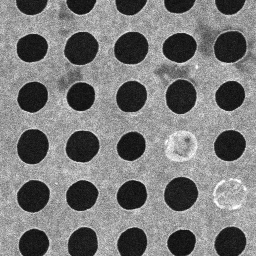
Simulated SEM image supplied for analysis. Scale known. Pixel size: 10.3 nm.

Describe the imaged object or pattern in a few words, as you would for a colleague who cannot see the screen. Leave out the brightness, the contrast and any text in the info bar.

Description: a regular array of holes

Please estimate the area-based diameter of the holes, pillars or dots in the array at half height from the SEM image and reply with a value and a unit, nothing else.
323 nanometers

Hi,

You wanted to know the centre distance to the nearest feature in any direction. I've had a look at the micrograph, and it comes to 502 nanometres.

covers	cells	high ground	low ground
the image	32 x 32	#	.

##....##....##....###...###...##
###..####..####..####..#####..##
################################
################################
###..####...###...###...###...##
##....##....##....##....###....#
##....##....##....##....###....#
###..####...###...###...###...##
################################
################################
###..#####.####...###...####..##
##....###...###...###....##....#
##....##....###...###....##....#
###..####..####...###...####..##
################################
################################
###..####..#################..##
##....###...###...#########....#
##....##....###...#########....#
##....###...###...#########...##
################################
################################
######################..########
###...###...###...###....#######
##....##....###...##.....#######
##....##....###...###...########
################################
################################
##########.#####.###########..##
###...###...###...###...###....#
##....##....###...###...###....#
##....###...###...###...###...##